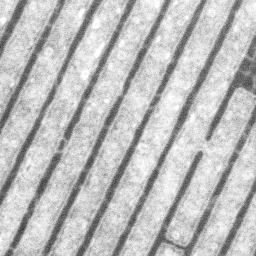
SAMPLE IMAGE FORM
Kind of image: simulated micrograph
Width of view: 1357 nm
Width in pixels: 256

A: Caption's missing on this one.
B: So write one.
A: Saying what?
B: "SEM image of parallel lines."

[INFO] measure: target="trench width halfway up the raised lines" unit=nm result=112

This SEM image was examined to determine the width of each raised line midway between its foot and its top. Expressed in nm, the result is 56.